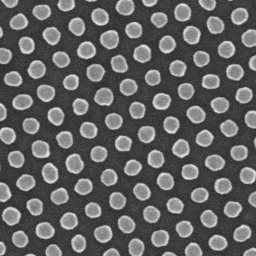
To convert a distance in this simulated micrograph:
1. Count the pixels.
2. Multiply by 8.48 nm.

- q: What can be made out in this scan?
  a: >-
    a regular array of raised bodies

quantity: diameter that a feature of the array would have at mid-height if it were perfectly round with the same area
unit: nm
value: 137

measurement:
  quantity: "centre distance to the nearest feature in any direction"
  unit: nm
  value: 212